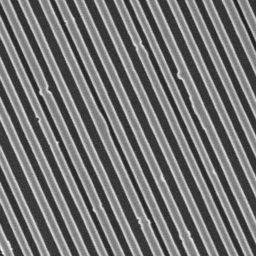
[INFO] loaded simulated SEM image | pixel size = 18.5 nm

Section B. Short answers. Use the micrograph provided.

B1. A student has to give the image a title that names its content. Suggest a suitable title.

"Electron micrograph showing parallel lines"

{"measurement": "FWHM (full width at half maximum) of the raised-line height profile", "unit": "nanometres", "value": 160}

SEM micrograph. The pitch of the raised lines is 0.309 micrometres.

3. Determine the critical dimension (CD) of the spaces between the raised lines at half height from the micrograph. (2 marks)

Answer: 145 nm